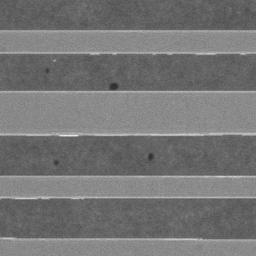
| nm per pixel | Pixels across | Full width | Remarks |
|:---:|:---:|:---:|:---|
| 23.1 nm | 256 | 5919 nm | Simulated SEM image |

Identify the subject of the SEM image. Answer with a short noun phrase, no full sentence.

lines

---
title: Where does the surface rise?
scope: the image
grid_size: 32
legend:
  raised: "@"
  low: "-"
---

--------------------------------
--------------------------------
--------------------------------
--------------------------------
@@@@@@@@@@@@@@@@@@@@@@@@@@@@@@@@
@@@@@@@@@@@@@@@@@@@@@@@@@@@@@@@@
@@@@@@@@@@@@@@@@@@@@@@@@@@@@@@@@
--------------------------------
--------------------------------
--------------------------------
--------------------------------
@@@@@@@@@@@@@@@@@@@@@@@@@@@@@@@@
@@@@@@@@@@@@@@@@@@@@@@@@@@@@@@@@
@@@@@@@@@@@@@@@@@@@@@@@@@@@@@@@@
@@@@@@@@@@@@@@@@@@@@@@@@@@@@@@@@
@@@@@@@@@@@@@@@@@@@@@@@@@@@@@@@@
@@@@@@@@@@@@@@@@@@@@@@@@@@@@@@@@
--------------------------------
--------------------------------
--------------------------------
--------------------------------
--------------------------------
@@@@@@@@@@@@@@@@@@@@@@@@@@@@@@@@
@@@@@@@@@@@@@@@@@@@@@@@@@@@@@@@@
@@@@@@@@@@@@@@@@@@@@@@@@@@@@@@@@
--------------------------------
--------------------------------
--------------------------------
--------------------------------
--------------------------------
@@@@@@@@@@@@@@@@@@@@@@@@@@@@@@@@
@@@@@@@@@@@@@@@@@@@@@@@@@@@@@@@@